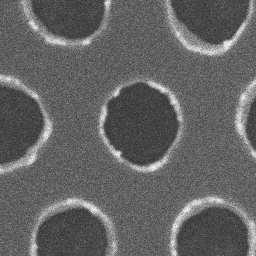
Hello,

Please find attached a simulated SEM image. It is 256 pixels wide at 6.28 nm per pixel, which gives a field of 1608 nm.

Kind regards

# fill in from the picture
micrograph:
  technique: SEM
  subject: holes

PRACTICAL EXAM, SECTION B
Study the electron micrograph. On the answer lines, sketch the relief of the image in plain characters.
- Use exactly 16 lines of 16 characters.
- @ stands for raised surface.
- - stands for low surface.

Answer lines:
@@-----@@@@-----
@@----@@@@@----@
@@@@-@@@@@@@--@@
@@@@@@@@@@@@@@@@
@@@@@@@@@@@@@@@@
-@@@@@@@--@@@@@@
--@@@@@----@@@@-
---@@@@----@@@@-
---@@@@----@@@@-
--@@@@@----@@@@@
@@@@@@@@@@@@@@@@
@@@@@@@@@@@@@@@@
@@@@@@@@@@@@@@@@
@@@---@@@@@@---@
@@-----@@@@-----
@@-----@@@@-----